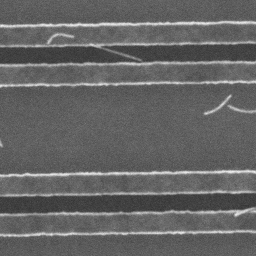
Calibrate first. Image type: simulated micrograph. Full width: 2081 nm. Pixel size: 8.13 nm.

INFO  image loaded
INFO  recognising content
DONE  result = lines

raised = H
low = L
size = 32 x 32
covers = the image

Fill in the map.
LLLLLLLLLLLLLLLLLLLLLLLLLLLLLLLL
LLLLLLLLLLLLLLLLLLLLLLLLLLLLLLLL
LLLLLLLLLLLLLLLLLLLLLLLLLLLLLLLL
HHHHHHHHHHHHHHHHHHHHHHHHHHHHHHHH
HHHHHHHHHHHHHHHHHHHHHHHHHHHHHHHH
HHHHHHHHHHHHHHHHHHHHHHHLLLLLLLLL
LLLLLLLLLLLLLLLLLLLLLLLLLLLLLLLL
LLLLLLLLLLLLLLLLLLLLLLLLLLLLLLLL
HHHHHHHHHHHHHHHHHHHHHHHHHHHHHHHH
HHHHHHHHHHHHHHHHHHHHHHHHHHHHHHHH
HHHHHHHHHHHHHHHHHHHLLLLLLLLLLLLL
LLLLLLLLLLLLLLLLLLLLLLLLLLLLLLLL
LLLLLLLLLLLLLLLLLLLLLLLLLLLLLLLL
LLLLLLLLLLLLLLLLLLLLLLLLLLLLLLLL
LLLLLLLLLLLLLLLLLLLLLLLLLLLLLLLL
LLLLLLLLLLLLLLLLLLLLLLLLLLLLLLLL
LLLLLLLLLLLLLLLLLLLLLLLLLLLLLLLL
LLLLLLLLLLLLLLLLLLLLLLLLLLLLLLLL
LLLLLLLLLLLLLLLLLLLLLLLLLLLLLLLL
LLLLLLLLLLLLLLLLLLLLLLLLLLLLLLLL
LLLLLLLLLLLLLLLLLLLLLLLLLLLLLLLL
LLLLLLLLLLLLLLLLLLLLLLLLLLLHHHHH
HHHHHHHHHHHHHHHHHHHHHHHHHHHHHHHH
HHHHHHHHHHHHHHHHHHHHHHHHHHHHHHHH
LLLLLLLLLLLLLLLLLLLLLLLLLLLLLLLL
LLLLLLLLLLLLLLLLLLLLLLLLLLLLLLLL
LLLLLLLLLLLLLLLLLLLLLHLHLLHHHHHH
HHHHHHHHHHHHHHHHHHHHHHHHHHHHHHHH
HHHHHHHHHHHHHHHHHHHHHHHHHHHHHHHH
LLLLLLLLLLLLLLLLLLLLLLLLLLLLLLLL
LLLLLLLLLLLLLLLLLLLLLLLLLLLLLLLL
LLLLLLLLLLLLLLLLLLLLLLLLLLLLLLLL